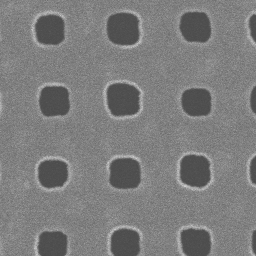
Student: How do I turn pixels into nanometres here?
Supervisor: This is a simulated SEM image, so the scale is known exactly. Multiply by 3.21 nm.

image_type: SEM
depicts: a regular array of holes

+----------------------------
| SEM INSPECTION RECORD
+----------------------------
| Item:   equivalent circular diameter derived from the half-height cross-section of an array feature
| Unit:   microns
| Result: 0.103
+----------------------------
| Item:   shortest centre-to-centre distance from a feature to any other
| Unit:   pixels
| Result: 70.1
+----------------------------